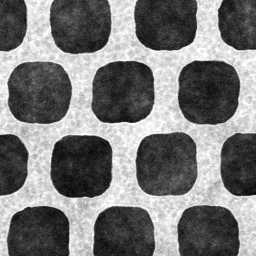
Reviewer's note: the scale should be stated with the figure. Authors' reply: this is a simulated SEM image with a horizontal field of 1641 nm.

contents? holes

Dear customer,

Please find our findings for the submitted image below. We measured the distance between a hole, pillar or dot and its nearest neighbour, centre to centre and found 537 nm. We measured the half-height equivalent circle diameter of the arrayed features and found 429 nm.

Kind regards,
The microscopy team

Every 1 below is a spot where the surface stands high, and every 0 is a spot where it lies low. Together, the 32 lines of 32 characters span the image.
00011100000000111000000001110000
00001100000000111000000001100000
00001100000000111000000001100000
00011100000000111000000001100000
00011100000000111000000011110000
00011110000001111100000011110000
11111111000011111111111111111111
11111111111111111111111111001111
11000000111100000001111000000111
10000000011100000001110000000011
10000000011100000001110000000011
10000000011000000001110000000011
10000000011000000001110000000011
10000000011000000001110000000011
11000000111100000001111000000111
11111011111111111111111110001111
11111111111111111111111111111111
00011110000001111100000011110000
00011110000000111000000001110000
00001100000000111000000001100000
00001100000000111000000001100000
00001100000000111000000001100000
00011100000000111000000001110000
00011110000000111100000011110000
01111111000011111110001111111001
11111111111111111111111111111111
11000000111110000011111000000111
10000000011100000001110000000011
10000000011100000001110000000011
10000000011100000001110000000011
10000000011100000001110000000011
10000000011100000001110000000011